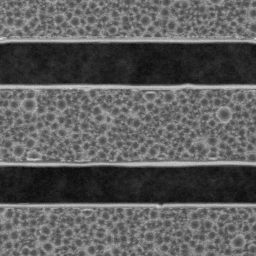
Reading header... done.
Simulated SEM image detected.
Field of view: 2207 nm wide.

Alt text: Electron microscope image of one or a few lines or trenches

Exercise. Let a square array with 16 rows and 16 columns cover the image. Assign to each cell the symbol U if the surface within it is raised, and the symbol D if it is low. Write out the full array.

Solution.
UUUUUUUUUUUUUUUU
UUUUUUUUUUUUUUUU
UUDUUUUUUDDUUUUU
DDDDDDDDDDDDDDDD
DDDDDDDDDDDDDDDD
UUUUUUUUUUUUUUUU
UUUUUUUUUUUUUUUU
UUUUUUUUUUUUUUUU
UUUUUUUUUUUUUUUU
UUUUUUUUUUUUUUUU
DDDDDDDDDDDDDDDD
DDDDDDDDDDDDDDDD
DDDDDDDDDDDDDDDD
UUUUUUUUUUUUUUUU
UUUUUUUUUUUUUUUU
UUUUUUUUUUUUUUUU